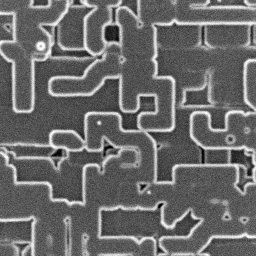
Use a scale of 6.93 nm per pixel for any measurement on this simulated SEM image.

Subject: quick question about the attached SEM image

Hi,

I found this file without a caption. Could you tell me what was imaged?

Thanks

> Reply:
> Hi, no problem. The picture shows wiring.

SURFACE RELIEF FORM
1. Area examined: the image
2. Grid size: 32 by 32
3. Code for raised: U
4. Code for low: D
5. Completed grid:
UUUUDDUUUDDUUUUDDUUUUUUUUUDDDDDU
UUUUUUUUDDDUUUDUUUUUUUUUUUUUUUUU
DDUUUUUUDDDUUUDUUUUUUUUUUUUUUUUU
DDUUUUDDDDDUUDDUUUUUDDDDDDDDDDDD
DDUUUUDDDDDUUDDUUUUDDDDDDDDDDDDD
UUUUUUDDDDDUUUUUUUUDDDDDDDDDDDDD
UUUUUUDDDDDUUUUUUUUDDDDDDDDDDDDD
DUUUUUDDDDDDUUUUUUUDDDDDDDDDDDDD
DDUUDDDDDDDUUUUUUUUUDDDDDDDDDDDU
DDUUDDDDDDUUUUUUUUUUDDDDDDDDDDDU
DDUUDDUUUUUUUDDUUUUUUUDDDDDDDDDU
DDUUDDUUUUUUDDDUUUUUUUDDDDDDDDDU
DDUUDDDDDDDDDDDUUDDUUUDDDDDDDDDU
DDUUDDDDDDDDDDDUUDDDUUDDDDDDDDDU
DDDDDDDDDDDUUUUDDUUUUUDDUUDDUUUU
DDDDDDDDDDDUUUUDDUUUUUDDUUDDUUUU
DDDDDDDUUDDUUUUUUUUDDDDDUUUUUUUU
DDDDDDUUUUUUUUUUUUUDDDDDUUUUUUUU
DDDDDDDDUUUUUDUUUUUDDDDDDUUUUUUU
UDDDDDDDDDDDDDUUUUUDDDDDDDDDDDDD
UDDDDDDDDDDDDUUUUUUDDDDDDDDDDDDD
UUDDDDDDDDUUUUUUUUUDDDUUUUUUUUDD
UUDDDDDDDDUUUUUUUUUUDUUUUUUUUUDD
UUUUUUDDDDUUUUUUUUUUUUUUUUUUUUUU
UUUUUUUDDDUUUUUUUUUUUUUUUUUUUUUU
UUUUUUUUUUUUUUUUUUUUUUUUUUUUUUUU
UUUUUUUUUUUUUDDDDDDDUUUUUUUUUUUU
UUUDUUUUUUUUUDDDDDDDUUDDDUUUUUUU
DDDDUUUUUUUUUDDDDDDDDDDDUUUUUUUU
DDDDUUUUUUUUUDDDDDDDDDDUUUUUUUUU
DDDDUUUUUUUUUUUUUUUUUUUUUUDDDDDD
DDDDUUUUUUUUUUUUUUUUUUUUUUDDDDDD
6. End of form